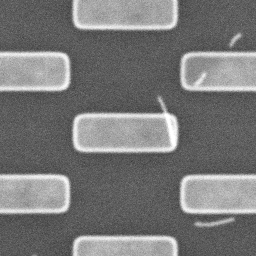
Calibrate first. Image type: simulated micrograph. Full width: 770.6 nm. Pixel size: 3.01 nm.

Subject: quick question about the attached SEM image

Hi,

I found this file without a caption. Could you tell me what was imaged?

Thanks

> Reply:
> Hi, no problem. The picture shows groups of lines, slits or small figures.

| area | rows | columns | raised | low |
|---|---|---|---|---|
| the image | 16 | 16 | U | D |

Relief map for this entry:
DDDDDUUUUUUDDDDD
DDDDDUUUUUUDDDDD
DDDDDDDDDDDDDDDD
UUUUDDDDDDDDUUUU
UUUUDDDDDDDUUUUU
UUUUDDDDDDDDUUUU
DDDDDDDDDDDDDDDD
DDDDDUUUUUUDDDDD
DDDDDUUUUUUDDDDD
DDDDDDDDDDDDDDDD
DDDDDDDDDDDDDDDD
UUUUDDDDDDDUUUUU
UUUUDDDDDDDUUUUU
DDDDDDDDDDDDDDDD
DDDDDDDDDDDDDDDD
DDDDDUUUUUUDDDDD